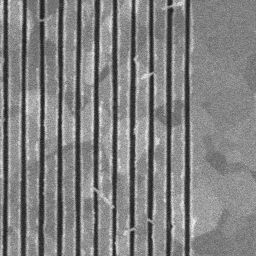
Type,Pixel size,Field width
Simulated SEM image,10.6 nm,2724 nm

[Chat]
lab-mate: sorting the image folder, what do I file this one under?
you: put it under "parallel lines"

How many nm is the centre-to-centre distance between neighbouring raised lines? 193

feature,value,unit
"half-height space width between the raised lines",0.0585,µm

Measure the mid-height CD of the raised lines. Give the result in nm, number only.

137